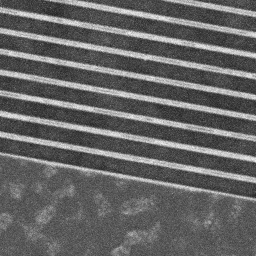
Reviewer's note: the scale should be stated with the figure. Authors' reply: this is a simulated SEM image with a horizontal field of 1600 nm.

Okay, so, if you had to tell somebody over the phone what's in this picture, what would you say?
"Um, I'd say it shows parallel lines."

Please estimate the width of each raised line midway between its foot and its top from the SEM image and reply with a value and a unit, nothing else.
23.1 nm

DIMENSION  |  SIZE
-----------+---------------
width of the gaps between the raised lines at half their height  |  0.105 micrometres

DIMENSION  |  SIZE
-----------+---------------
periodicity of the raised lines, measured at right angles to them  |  0.128 microns